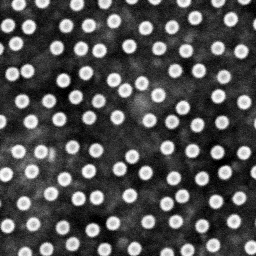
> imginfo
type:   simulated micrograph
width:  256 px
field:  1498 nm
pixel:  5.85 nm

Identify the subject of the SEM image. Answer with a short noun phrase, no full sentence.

a regular array of raised bodies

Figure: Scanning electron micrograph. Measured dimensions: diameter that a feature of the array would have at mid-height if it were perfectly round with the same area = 68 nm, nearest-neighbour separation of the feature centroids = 127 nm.